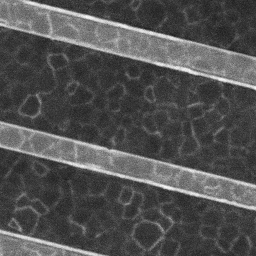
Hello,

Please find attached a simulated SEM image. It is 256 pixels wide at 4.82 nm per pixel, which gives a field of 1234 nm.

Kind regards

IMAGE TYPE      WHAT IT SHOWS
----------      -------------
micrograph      one or a few lines or trenches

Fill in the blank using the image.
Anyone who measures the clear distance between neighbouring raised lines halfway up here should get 94.1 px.